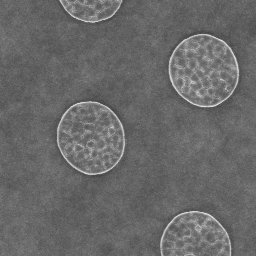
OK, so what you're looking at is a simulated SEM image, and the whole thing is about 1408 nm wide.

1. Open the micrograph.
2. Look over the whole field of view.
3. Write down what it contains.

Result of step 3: raised bodies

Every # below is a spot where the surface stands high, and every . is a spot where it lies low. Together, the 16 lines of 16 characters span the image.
....###.........
................
............##..
...........####.
...........####.
...........####.
.....#......##..
....###.........
....####........
....####........
.....##.........
................
................
...........##...
..........####..
..........####..